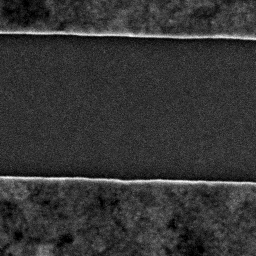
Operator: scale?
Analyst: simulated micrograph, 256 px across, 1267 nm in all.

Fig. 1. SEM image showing one or a few lines or trenches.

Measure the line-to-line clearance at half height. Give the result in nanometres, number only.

711